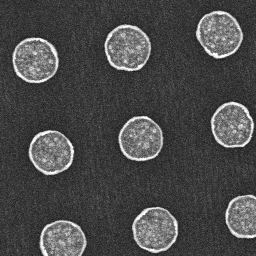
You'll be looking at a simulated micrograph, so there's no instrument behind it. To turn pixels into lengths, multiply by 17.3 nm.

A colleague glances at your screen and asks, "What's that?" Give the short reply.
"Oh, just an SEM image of raised bodies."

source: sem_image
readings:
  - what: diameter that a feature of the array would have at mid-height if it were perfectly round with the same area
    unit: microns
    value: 0.762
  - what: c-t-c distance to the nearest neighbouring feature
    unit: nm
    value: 1590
